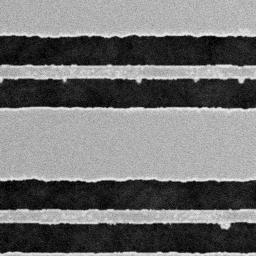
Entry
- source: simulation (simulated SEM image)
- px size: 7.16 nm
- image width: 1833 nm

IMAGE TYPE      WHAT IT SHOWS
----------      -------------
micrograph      lines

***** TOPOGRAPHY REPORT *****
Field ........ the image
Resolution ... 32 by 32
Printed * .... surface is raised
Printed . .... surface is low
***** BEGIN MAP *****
********************************
********************************
********************************
********************************
...*******..****...*....*..*.*.*
................................
................................
................................
********************************
********************************
................................
................................
................................
...***********..**..******......
********************************
********************************
********************************
********************************
********************************
********************************
********************************
********************************
*....********.**....******.****.
................................
................................
................................
********************************
********************************
................................
................................
................................
................................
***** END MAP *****